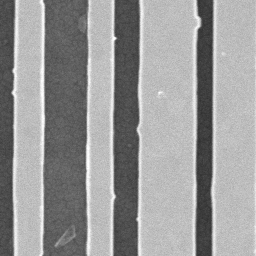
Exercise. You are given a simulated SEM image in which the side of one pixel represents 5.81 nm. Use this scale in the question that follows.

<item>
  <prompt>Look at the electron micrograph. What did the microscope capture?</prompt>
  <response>one or a few lines or trenches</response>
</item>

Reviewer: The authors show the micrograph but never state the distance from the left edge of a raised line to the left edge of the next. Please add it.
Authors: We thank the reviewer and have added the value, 403 nm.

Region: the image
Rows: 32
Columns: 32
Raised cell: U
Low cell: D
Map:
DDUUUDDDDDDUUUDDDDUUUUUUDDDUUUUU
DDUUUDDDDDDUUUDDDDUUUUUUDDDUUUUU
DDUUUDDDDDDUUUDDDDUUUUUUUDDUUUUU
DDUUUDDDDDDUUUDDDDUUUUUUUDDUUUUU
DDUUUDDDDDDUUUDDDDUUUUUUDDDUUUUU
DDUUUDDDDDDUUUDDDDUUUUUUDDDUUUUU
DDUUUDDDDDDUUUDDDDUUUUUUDDDUUUUU
DDUUUDDDDDDUUUDDDDUUUUUUDDDUUUUU
DDUUUDDDDDDUUUDDDDUUUUUUDDDUUUUU
DDUUUDDDDDDUUUDDDUUUUUUUDDDUUUUU
DDUUUDDDDDDUUUDDDUUUUUUUDDDUUUUU
DDUUUDDDDDDUUUDDDUUUUUUUDDDUUUUU
DDUUUDDDDDDUUUDDDUUUUUUUDDDUUUUU
DDUUUDDDDDDUUUDDDDUUUUUUDDDUUUUU
DDUUUDDDDDDUUUDDDDUUUUUUDDDUUUUU
DDUUUDDDDDDUUUDDDUUUUUUUDDDUUUUU
DDUUUDDDDDDUUUDDDUUUUUUUDDDUUUUU
DDUUUDDDDDDUUUDDDDUUUUUUDDDUUUUU
DDUUUDDDDDDUUUDDDDUUUUUUDDDUUUUU
DDUUUDDDDDDUUUDDDUUUUUUUDDDUUUUU
DDUUUDDDDDDUUUDDDUUUUUUUDDDUUUUU
DDUUUDDDDDDUUUDDDUUUUUUUDDDUUUUU
DDUUUDDDDDDUUUDDDUUUUUUUDDDUUUUU
DDUUUDDDDDDUUUDDDUUUUUUUDDDUUUUU
DDUUUDDDDDDUUUDDDUUUUUUUDDDUUUUU
DDUUUDDDDDDUUUDDDUUUUUUUDDDUUUUU
DDUUUDDDDDDUUUDDDUUUUUUUDDDUUUUU
DDUUUDDDDDDUUUDDDUUUUUUUDDDUUUUU
DDUUUDDDDDDUUUDDDUUUUUUUDDDUUUUU
DDUUUDDDDDDUUUDDDUUUUUUUDDDUUUUU
DDUUUDDDDDDUUUDDDUUUUUUUDDDUUUUU
DDUUUDDDDDDUUUDDDUUUUUUUDDDUUUUU